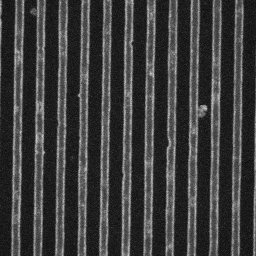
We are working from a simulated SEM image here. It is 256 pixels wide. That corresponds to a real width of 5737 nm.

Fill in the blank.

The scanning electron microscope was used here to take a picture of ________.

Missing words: parallel lines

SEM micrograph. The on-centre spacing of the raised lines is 22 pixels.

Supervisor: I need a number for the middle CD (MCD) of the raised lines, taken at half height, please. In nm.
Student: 171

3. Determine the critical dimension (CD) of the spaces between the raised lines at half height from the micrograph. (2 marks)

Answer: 322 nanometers